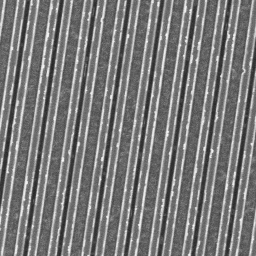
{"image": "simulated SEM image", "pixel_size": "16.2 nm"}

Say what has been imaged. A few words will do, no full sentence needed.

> parallel lines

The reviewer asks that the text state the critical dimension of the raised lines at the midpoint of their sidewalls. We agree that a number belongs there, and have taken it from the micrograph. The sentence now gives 128 nm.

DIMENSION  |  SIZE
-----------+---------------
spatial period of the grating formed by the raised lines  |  16.5 pixels